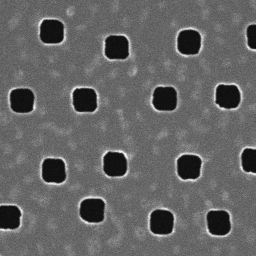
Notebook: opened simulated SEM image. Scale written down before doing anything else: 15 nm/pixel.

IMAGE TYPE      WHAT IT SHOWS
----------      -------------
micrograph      a regular array of holes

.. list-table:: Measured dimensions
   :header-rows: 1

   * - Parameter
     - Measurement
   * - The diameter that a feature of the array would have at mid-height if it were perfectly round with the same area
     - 392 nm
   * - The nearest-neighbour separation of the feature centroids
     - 919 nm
